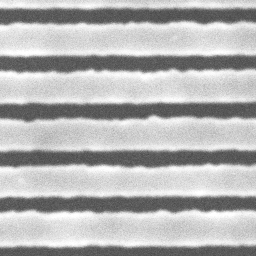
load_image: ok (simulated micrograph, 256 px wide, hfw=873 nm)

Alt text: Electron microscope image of lines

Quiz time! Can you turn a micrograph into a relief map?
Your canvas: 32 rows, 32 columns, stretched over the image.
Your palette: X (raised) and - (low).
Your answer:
XXXXXXXXXXXXXXXXXXXXXXXXXXXXXXXX
--------------------------------
--------------------------------
XXXXXXXXXXXXXXXXXXXXXXXXXXXXXXXX
XXXXXXXXXXXXXXXXXXXXXXXXXXXXXXXX
XXXXXXXXXXXXXXXXXXXXXXXXXXXXXXXX
XXXXXXXXXXXXXXXXXXXXXXXXXXXXXXXX
--------------------------------
--------------------------------
XXXXXXXXXXXXXXXXXXXXXXXXXXXXXXXX
XXXXXXXXXXXXXXXXXXXXXXXXXXXXXXXX
XXXXXXXXXXXXXXXXXXXXXXXXXXXXXXXX
XXXXXXXXXXXXXXXXXXXXXXXXXXXXXXXX
--------------------------------
--------------------------------
XXXXXXXXXXXXXXXXXXXXXXXXXXXXXXXX
XXXXXXXXXXXXXXXXXXXXXXXXXXXXXXXX
XXXXXXXXXXXXXXXXXXXXXXXXXXXXXXXX
XXXXXXXXXXXXXXXXXXXXXXXXXXXXXXXX
--------------------------------
--------------------------------
XXXXXXXXXXXXXXXXXXXXXXXXXXXXXXXX
XXXXXXXXXXXXXXXXXXXXXXXXXXXXXXXX
XXXXXXXXXXXXXXXXXXXXXXXXXXXXXXXX
XXXXXXXXXX-XXX-XX-------------X-
--------------------------------
---X----------------X--XX----XXX
XXXXXXXXXXXXXXXXXXXXXXXXXXXXXXXX
XXXXXXXXXXXXXXXXXXXXXXXXXXXXXXXX
XXXXXXXXXXXXXXXXXXXXXXXXXXXXXXXX
XXXXXXXXXXXXXXXXXXXXXXXXXXXXXXXX
--------------------------------